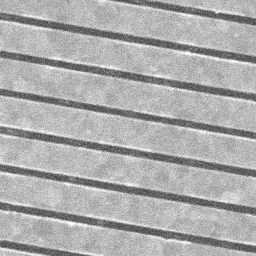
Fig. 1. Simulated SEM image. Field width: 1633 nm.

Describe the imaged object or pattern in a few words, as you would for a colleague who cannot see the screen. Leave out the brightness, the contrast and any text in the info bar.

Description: parallel lines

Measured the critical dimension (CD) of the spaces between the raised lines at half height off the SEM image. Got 8.37 px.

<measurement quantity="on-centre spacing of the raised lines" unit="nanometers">238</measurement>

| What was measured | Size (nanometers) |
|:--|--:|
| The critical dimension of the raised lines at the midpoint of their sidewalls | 185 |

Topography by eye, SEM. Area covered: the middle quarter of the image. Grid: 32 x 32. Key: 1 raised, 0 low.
00000000011111111111111111111111
10000000000000111111111111111111
11111110000000000001111111111111
11111111111110000000000000111111
11111111111111111110000000000001
11111111111111111111111100000000
11111111111111111111111111111100
11111111111111111111111111111111
11111111111111111111111111111111
00000111111111111111111111111111
00000000001111111111111111111111
11110000000000001111111111111111
11111111110000000000001111111111
11111111111111110000000000001111
11111111111111111111100000000000
11111111111111111111111111100000
11111111111111111111111111111111
11111111111111111111111111111111
00011111111111111111111111111111
00000000111111111111111111111111
10000000000000111111111111111111
11111110000000000000111111111111
11111111111110000000000000111111
11111111111111111100000000000000
11111111111111111111111100000000
11111111111111111111111111111100
11111111111111111111111111111111
11111111111111111111111111111111
00000111111111111111111111111111
00000000000111111111111111111111
11111000000000000111111111111111
11111111110000000000000111111111